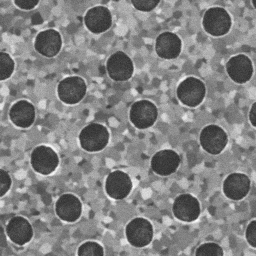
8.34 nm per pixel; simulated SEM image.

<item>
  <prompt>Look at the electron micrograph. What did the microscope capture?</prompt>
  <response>a regular array of holes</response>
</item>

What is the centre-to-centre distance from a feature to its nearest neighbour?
433 nm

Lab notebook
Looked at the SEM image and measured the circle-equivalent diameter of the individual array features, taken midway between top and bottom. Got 0.244 µm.